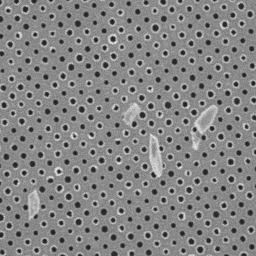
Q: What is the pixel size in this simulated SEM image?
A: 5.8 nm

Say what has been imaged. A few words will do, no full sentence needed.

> a regular array of holes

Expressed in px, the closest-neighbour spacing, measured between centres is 11.9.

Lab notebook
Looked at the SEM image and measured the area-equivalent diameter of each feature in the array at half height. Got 30 nm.